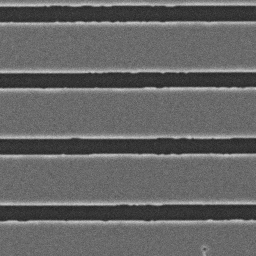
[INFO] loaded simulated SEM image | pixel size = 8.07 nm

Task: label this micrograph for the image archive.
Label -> lines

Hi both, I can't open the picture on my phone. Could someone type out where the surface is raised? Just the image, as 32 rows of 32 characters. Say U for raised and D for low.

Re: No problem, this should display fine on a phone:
UUUUUUUUUUUUUUUUUUUUUUUUUUUUUUUU
DDDDDDDDDDDDDDDDDDDDDDDDDDDDDDDD
DDDDDDDDDDDDDDDDDDDDDDDDDDDDDDDD
UUUUUUUUUUUUUUUUUUUUUUUUUUUUUUUU
UUUUUUUUUUUUUUUUUUUUUUUUUUUUUUUU
UUUUUUUUUUUUUUUUUUUUUUUUUUUUUUUU
UUUUUUUUUUUUUUUUUUUUUUUUUUUUUUUU
UUUUUUUUUUUUUUUUUUUUUUUUUUUUUUUU
UUUUUUUUUUUUUUUUUUUUUUUUUUUUUUUU
DDDDDDDDDDDDDDDDDDDDDDDDDDDDDDDD
DDDDDDDDDDDDDDDDDDDDDDDDDDDDDDDD
UUUUUUUUUUUUUUUUUUUUUUUUUUUUUUUU
UUUUUUUUUUUUUUUUUUUUUUUUUUUUUUUU
UUUUUUUUUUUUUUUUUUUUUUUUUUUUUUUU
UUUUUUUUUUUUUUUUUUUUUUUUUUUUUUUU
UUUUUUUUUUUUUUUUUUUUUUUUUUUUUUUU
UUUUUUUUUUUUUUUUUUUUUUUUUUUUUUUU
DDDDDDDDDDDDDDDDDDDDDDDDDDDDDDDD
DDDDDDDDDDDDDDDDDDDDDDDDDDDDDDDD
UUUUUUUUUUUUUUUUUUUUUUUUUUUUUUUU
UUUUUUUUUUUUUUUUUUUUUUUUUUUUUUUU
UUUUUUUUUUUUUUUUUUUUUUUUUUUUUUUU
UUUUUUUUUUUUUUUUUUUUUUUUUUUUUUUU
UUUUUUUUUUUUUUUUUUUUUUUUUUUUUUUU
UUUUUUUUUUUUUUUUUUUUUUUUUUUUUUUU
UUUUUUUUUUUUUUUDDUDUDDDDDDDDDDDD
DDDDDDDDDDDDDDDDDDDDDDDDDDDDDDDD
DDDDDDDDDDDDDDDDDDDDDDDDDDDDDDDD
UUUUUUUUUUUUUUUUUUUUUUUUUUUUUUUU
UUUUUUUUUUUUUUUUUUUUUUUUUUUUUUUU
UUUUUUUUUUUUUUUUUUUUUUUUUUUUUUUU
UUUUUUUUUUUUUUUUUUUUUUUUUUUUUUUU